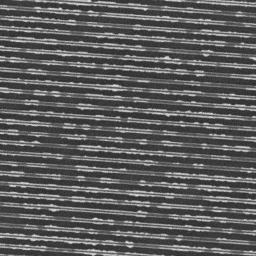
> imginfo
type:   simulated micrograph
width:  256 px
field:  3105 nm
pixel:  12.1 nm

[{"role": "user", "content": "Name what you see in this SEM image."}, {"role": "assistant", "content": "parallel lines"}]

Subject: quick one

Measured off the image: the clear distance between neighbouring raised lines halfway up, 0.0832 µm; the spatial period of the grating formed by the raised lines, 126 nanometers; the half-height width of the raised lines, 42.3 nm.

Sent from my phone